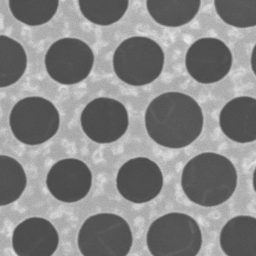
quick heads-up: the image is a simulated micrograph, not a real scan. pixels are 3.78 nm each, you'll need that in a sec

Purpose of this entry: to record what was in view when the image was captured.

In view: a regular array of holes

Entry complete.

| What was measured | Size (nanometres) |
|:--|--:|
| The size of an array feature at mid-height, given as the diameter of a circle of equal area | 182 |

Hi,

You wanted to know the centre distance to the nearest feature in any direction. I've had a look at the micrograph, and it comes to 261 nm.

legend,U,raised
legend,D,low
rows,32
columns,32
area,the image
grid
UDDDDDDUUUDDDDDDUUDDDDDDDUUDDDDD
UDDDDDDUUUDDDDDDUUUDDDDDDUUDDDDD
UUDDDDUUUUUDDDDUUUUDDDDDUUUUDDDD
UUUUUUUUUUUUUUUUUUUUUUUUUUUUUUDU
DUUUUUUUUUUUUUUUUUUUUUUUUUUUUUUU
DDDUUUUDDDDUUUUDDDDDUUUUDDDDUUUU
DDDUUUDDDDDDUUDDDDDDUUUDDDDDDUUD
DDDUUUDDDDDDUUDDDDDDDUUDDDDDDUUD
DDDUUUDDDDDUUUDDDDDDUUUDDDDDDUUD
DDDUUUDDDDDUUUUDDDDDUUUUDDDDUUUU
DDUUUUUUDUUUUUUUDDUUUUUUUUUUUUUU
UUUUUUUUUUUUUUUUUUUUUDUUUUUUUUUU
UUUDDDUUUUUUDDUUUUUDDDDDUUUUUDDD
UUDDDDDUUUUDDDDDUUDDDDDDDUUUDDDD
UDDDDDDUUUDDDDDDUUDDDDDDDUUDDDDD
UDDDDDDUUUDDDDDDUUDDDDDDDUUDDDDD
UUDDDDDUUUUDDDDDUUDDDDDDDUUUDDDD
UUDDDDUUUUUDDDDUUUUDDDDDUUUUUDDD
UUUUUUUUUUUUUUUUUUUUUUUUUUUUUUUU
DUUUUUUUUUUUUUUUUUUUUUUUDDDDUUUU
DDUUUUUDDDDUUUUDDDDDUUUDDDDDDUUU
DDDUUUDDDDDUUUUDDDDDUUUDDDDDDDUU
DDDUUUDDDDDDUUDDDDDDUUUDDDDDDDUU
DDDUUUDDDDDUUUUDDDDDUUUDDDDDDUUU
DDDUUUUDDDDUUUUDDDDDUUUDDDDDDUUU
DUUUUUUUUUUUUUUUUUUUUUUUUDDDUUUU
UUUUUUUUUUUUUUUUUUUUUUUUUUUUUUUU
UUUDDDUUUUUDDDDDUUUDDDDDUUUUUDDD
UUDDDDDUUUDDDDDDUUUDDDDDDUUUDDDD
UUDDDDDUUUDDDDDDUUDDDDDDDUUUDDDD
UUDDDDDUUUDDDDDDUUDDDDDDDUUUDDDD
UUDDDDDUUUDDDDDDUUUDDDDDDUUUDDDD